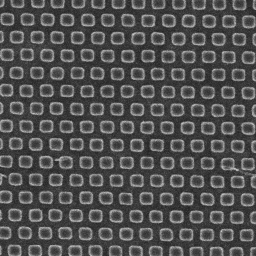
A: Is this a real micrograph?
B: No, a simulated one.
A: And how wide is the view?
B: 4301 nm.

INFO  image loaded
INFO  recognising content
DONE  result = a regular array of raised bodies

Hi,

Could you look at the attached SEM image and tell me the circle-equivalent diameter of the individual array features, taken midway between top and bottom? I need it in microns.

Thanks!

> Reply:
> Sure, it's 0.224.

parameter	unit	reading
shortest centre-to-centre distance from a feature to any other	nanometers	334